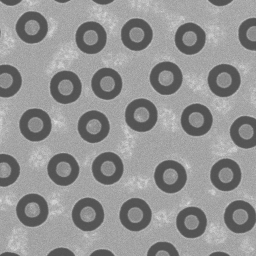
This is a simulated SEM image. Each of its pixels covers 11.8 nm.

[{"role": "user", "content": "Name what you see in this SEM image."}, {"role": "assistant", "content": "a regular array of ring-shaped grooves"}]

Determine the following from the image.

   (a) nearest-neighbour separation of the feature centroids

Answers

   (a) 46.7 px